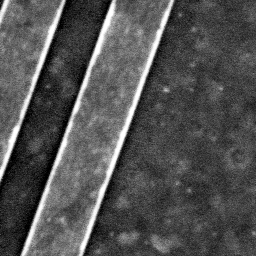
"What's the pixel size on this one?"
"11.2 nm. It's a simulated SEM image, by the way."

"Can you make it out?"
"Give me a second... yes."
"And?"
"one or a few lines or trenches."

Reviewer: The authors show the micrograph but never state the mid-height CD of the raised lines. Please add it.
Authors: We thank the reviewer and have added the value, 609 nanometers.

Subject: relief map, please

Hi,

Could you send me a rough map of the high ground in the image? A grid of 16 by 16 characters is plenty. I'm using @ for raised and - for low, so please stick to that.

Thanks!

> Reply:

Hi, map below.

@@@@---@@@@-----
@@@----@@@------
@@@---@@@@------
@@@---@@@-------
@@----@@@-------
@@---@@@@-------
@@---@@@--------
@---@@@@--------
@---@@@@--------
@---@@@---------
---@@@@---------
---@@@@---------
---@@@----------
--@@@@----------
--@@@@----------
--@@@-----------